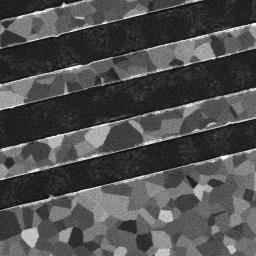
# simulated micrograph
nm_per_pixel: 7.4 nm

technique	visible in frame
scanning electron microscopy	one or a few lines or trenches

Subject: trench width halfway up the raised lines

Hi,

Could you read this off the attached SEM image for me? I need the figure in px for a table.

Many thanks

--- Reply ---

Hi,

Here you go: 34.9